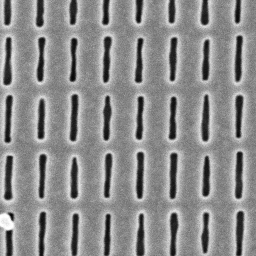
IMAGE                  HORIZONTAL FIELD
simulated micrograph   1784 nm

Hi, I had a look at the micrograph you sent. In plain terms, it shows a regular array of holes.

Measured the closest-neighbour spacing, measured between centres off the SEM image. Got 0.228 micrometres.